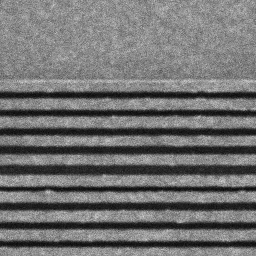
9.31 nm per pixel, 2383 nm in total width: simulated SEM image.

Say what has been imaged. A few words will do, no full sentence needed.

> parallel lines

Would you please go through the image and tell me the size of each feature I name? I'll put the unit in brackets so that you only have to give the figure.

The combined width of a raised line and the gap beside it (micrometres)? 0.174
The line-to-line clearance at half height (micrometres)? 0.0698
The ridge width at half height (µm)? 0.105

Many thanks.